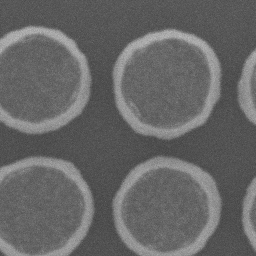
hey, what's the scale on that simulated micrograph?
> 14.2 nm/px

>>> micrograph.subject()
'raised bodies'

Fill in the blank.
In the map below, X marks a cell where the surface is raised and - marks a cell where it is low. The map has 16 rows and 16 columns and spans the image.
----------------
----------------
-XXX-----XXX----
XXXXX---XXXXX---
XXXXX--XXXXXX--X
XXXXX--XXXXXX--X
XXXXX---XXXXX--X
-XXX----XXXX----
----------------
----------------
-XXX-----XXX----
XXXXX---XXXXX---
XXXXXX-XXXXXX---
XXXXX--XXXXXX--X
XXXXX---XXXXX---
XXXX-----XXX----